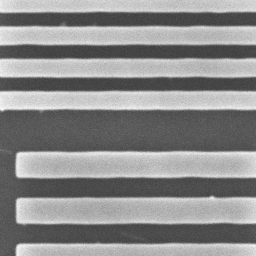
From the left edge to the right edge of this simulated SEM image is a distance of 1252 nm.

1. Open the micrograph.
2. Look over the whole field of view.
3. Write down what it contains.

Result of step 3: groups of lines, slits or small figures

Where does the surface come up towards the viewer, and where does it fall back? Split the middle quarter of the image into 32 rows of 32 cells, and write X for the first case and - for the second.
XXXXXXXXXXXXXXXXXXXXXXXXXXXXXXXX
XXXXXXXXXXXXXXXXXXXXXXXXXXXXXXXX
XXXXXXXXXXXXXXXXXXXXXXXXXXXXXXXX
--------------------------------
--------------------------------
--------------------------------
--------------------------------
XXXXXXXXXXXXXXXXXXXXXXXXXXXXXXXX
XXXXXXXXXXXXXXXXXXXXXXXXXXXXXXXX
XXXXXXXXXXXXXXXXXXXXXXXXXXXXXXXX
XXXXXXXXXXXXXXXXXXXXXXXXXXXXXXXX
--------------------------------
--------------------------------
--------------------------------
--------------------------------
--------------------------------
--------------------------------
--------------------------------
--------------------------------
--------------------------------
--------------------------------
--------------------------------
XXXXXXXXXXXXXXXXXXXXXXXXXXXXXXXX
XXXXXXXXXXXXXXXXXXXXXXXXXXXXXXXX
XXXXXXXXXXXXXXXXXXXXXXXXXXXXXXXX
XXXXXXXXXXXXXXXXXXXXXXXXXXXXXXXX
XXXXXXXXXXXXXXXXXXXXXXXXXXXXXXXX
XXXXXXXXXXXXXXXXXXXXXXXXXXXXXXXX
--------------------------------
--------------------------------
--------------------------------
--------------------------------